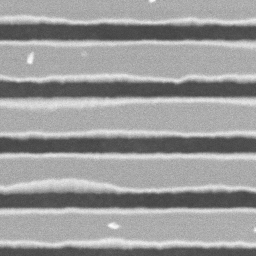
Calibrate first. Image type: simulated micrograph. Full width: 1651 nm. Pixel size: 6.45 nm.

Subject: lines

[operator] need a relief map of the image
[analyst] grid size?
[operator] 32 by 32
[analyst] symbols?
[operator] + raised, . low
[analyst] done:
++++++++++++++++++++++++++++++++
++++++++++++++++++++++++++++++++
++++++++++++++++++++++++++++++++
................................
................................
++++++++++++++++++++++++++++++++
++++++++++++++++++++++++++++++++
++++++++++++++++++++++++++++++++
++++++++++++++++++++++++++++++++
++++++++++++++++++++++++++++++++
................................
................................
++++++++++++++++++++++++++++++++
++++++++++++++++++++++++++++++++
++++++++++++++++++++++++++++++++
++++++++++++++++++++++++++++++++
++++++++++++++++++++++++++++++++
................................
................................
++++++++++++++++++++++++++++++++
++++++++++++++++++++++++++++++++
++++++++++++++++++++++++++++++++
++++++++++++++++++++++++++++++++
++++++++++++++++++++++++++++++++
................................
................................
++++++++++++++++++++++++++++++++
++++++++++++++++++++++++++++++++
++++++++++++++++++++++++++++++++
++++++++++++++++++++++++++++++++
++++++++++++++++++++++++++++++++
................................